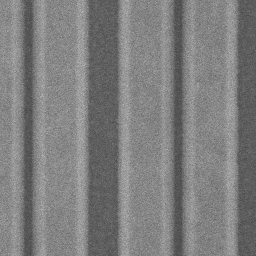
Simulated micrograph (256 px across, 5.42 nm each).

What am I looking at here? one or a few lines or trenches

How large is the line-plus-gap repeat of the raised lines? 406 nm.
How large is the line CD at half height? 227 nm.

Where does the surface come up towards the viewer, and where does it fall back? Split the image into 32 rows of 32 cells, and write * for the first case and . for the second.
**...*****......*****...*****...
**...*****......*****...*****...
**...*****......*****...*****...
**...*****......*****...*****...
**...*****......*****...*****...
**...*****......*****...*****...
**...*****......*****...*****...
**...*****......*****...*****...
**...*****......*****...*****...
**...*****......*****...*****...
**...*****......*****...*****...
**...*****......*****...*****...
**...*****......*****...*****...
**...*****......*****...*****...
**...*****......*****...*****...
**...*****......*****...*****...
**...*****......*****...*****...
**...*****......*****...*****...
**...*****......*****...*****...
**...*****......*****...*****...
**...*****......*****...*****...
**...*****......*****...*****...
**...*****......*****...*****...
**...*****......*****...*****...
**...*****......*****...*****...
**...*****......*****...*****...
**...*****......*****...*****...
**...*****......*****...*****...
**...*****......*****...*****...
**...*****......*****...*****...
**...*****......*****...*****...
**...*****......*****...*****...